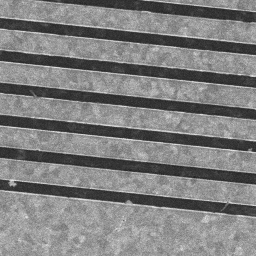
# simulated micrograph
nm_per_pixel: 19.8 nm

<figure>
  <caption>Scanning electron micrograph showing parallel lines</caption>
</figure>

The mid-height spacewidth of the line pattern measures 11.4 pixels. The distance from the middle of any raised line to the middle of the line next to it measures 0.638 microns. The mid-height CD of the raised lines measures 20.3 px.